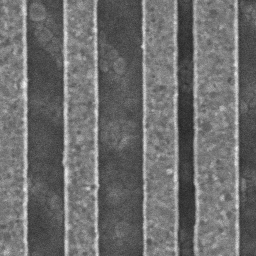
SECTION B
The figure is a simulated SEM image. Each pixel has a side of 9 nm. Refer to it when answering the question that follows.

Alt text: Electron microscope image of one or a few lines or trenches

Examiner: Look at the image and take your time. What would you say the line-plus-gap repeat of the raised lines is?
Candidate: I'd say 609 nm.